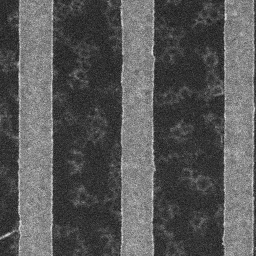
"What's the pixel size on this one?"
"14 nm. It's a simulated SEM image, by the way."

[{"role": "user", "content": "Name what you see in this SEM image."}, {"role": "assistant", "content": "one or a few lines or trenches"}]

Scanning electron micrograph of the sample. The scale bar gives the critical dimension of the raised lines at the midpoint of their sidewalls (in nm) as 441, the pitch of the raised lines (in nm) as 1420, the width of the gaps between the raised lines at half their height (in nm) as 987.